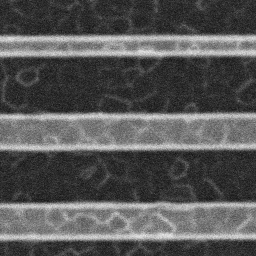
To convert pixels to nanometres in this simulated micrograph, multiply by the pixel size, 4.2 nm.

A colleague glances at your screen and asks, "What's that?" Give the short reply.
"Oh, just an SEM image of one or a few lines or trenches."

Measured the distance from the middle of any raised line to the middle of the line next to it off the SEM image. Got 87.7 px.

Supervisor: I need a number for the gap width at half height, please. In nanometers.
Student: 250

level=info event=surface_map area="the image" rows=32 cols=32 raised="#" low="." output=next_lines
................................
................................
................................
................................
................................
################################
################################
................................
................................
................................
................................
................................
................................
................................
......#..#######..........######
################################
################################
################################
.##########.....................
................................
................................
................................
................................
................................
................................
....................#...........
################################
################################
################################
################################
................................
................................